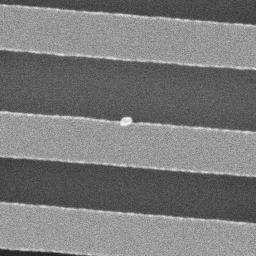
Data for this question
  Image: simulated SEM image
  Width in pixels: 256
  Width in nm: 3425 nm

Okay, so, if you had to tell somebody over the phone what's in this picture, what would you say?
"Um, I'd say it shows lines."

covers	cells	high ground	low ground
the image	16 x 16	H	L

HHHLLLLLLLLLLLLL
HHHHHHHHHHHHHHHL
HHHHHHHHHHHHHHHH
LLLLLHHHHHHHHHHH
LLLLLLLLLLLLLLLL
LLLLLLLLLLLLLLLL
LLLLLLLLLLLLLLLL
HHHHHHLHLLLLLLLL
HHHHHHHHHHHHHHHH
HHHHHHHHHHHHHHHH
LLLLLLLLLHHHHHHH
LLLLLLLLLLLLLLLL
LLLLLLLLLLLLLLLL
HHHHHHHHHHLLLLLL
HHHHHHHHHHHHHHHH
HHHHHHHHHHHHHHHH